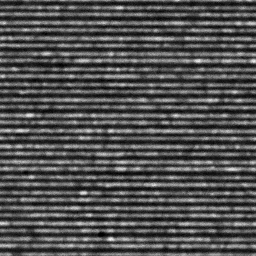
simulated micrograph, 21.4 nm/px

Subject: parallel lines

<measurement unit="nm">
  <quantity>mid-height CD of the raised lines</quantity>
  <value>64.2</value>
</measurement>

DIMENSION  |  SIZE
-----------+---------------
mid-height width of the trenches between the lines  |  0.112 micrometres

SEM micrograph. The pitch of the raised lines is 164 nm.